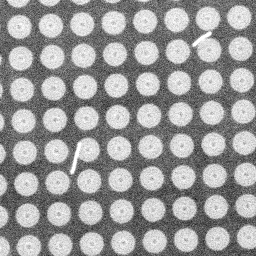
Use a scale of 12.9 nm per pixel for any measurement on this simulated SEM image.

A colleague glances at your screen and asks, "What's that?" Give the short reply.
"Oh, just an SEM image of an array of small figures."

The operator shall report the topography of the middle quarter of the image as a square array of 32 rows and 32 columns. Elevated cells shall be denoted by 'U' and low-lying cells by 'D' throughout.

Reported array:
UUUUDDUUUUUUUUUUUUUUUUUUUUUUUUUU
UUUUUUUUUUUUUUUUUUUUUUUUUUUUUUUU
UUUUUUUUUUUUUUUUUUUUDDUUUUUDDDUU
UUUUDDDUUUUDDDDUUUUDDDDUUUDDDDDU
UUUDDDDDUUUDDDDDUUDDDDDDUUDDDDDU
UUUDDDDDUUDDDDDDUUDDDDDDUUDDDDDU
UUUDDDDDUUUDDDDDUUUDDDDUUUUDDDDU
UUUDDDDUUUUDDDDUUUUUDDUUUUUUUUUU
UUUUUDUUUUUUUUUUUUUUUUUUUUUUUUUU
UUUUUUUUUUUUUUUUUUUUUUUUUUUUUUUU
UUUUUUUUUUUUUUUUUUUUDDDUUUUDDDDU
UUUUDDDUUUUDDDDUUUUDDDDDUUUDDDDD
UUUDDDDDUUUDDDDDUUUDDDDDUUDDDDDD
UUUDDDDDUUUDDDDDUUUDDDDDUUUDDDDD
UUUDDDDDUUUDDDDDUUUDDDDDUUUDDDDU
UUUUDDDDUUUUDDDUUUUUDDUUUUUUUUUU
UUUUUUUUUUUUUUUUUUUUUUUUUUUUUUUU
UUUUUUUUUUUUUUUUUUUUUUUUUUUUUUUU
UUUUUUUUUUUUUDDUUUUUDDDUUUUUDDDU
UUUUDDDDUUUUDDDDUUUDDDDDUUUDDDDD
UUUUDDDDUUUDDDDDUUUDDDDDUUUDDDDD
DUUUDDDDDUUDDDDDDUUDDDDDUUUDDDDD
DUUUDDDDDUUDDDDDUUUDDDDDUUUUDDDU
UUUUDDDDUUUUDDDUUUUUUDUUUUUUUUUU
UUUUUUUUUUUUUUUUUUUUUUUUUUUUUUUU
UUUUUUUUUUUUUUUUUUUUUUUUUUUUUUUU
UUUUUUUUUUUUUDDUUUUUDDDDUUUUDDDD
UUUUDDDDUUUUDDDDUUUDDDDDUUUDDDDD
DUUUDDDDDUUDDDDDDUUDDDDDDUUDDDDD
DUUDDDDDDUUDDDDDDUUDDDDDDUUDDDDD
DUUUDDDDDUUUDDDDUUUUDDDDUUUUDDDU
UUUUUDDDUUUUUDDUUUUUUUUUUUUUUUUU